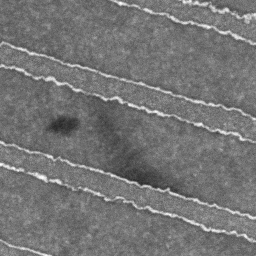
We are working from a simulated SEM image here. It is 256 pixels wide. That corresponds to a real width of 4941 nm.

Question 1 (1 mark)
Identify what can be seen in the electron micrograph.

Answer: one or a few lines or trenches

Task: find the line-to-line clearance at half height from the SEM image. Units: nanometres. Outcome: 1410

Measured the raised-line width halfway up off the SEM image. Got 428 nm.